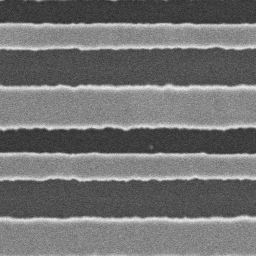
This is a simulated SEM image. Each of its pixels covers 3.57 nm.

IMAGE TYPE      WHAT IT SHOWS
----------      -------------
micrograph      lines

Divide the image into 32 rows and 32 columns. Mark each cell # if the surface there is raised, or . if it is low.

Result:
................................
................................
................................
################################
################################
################################
................................
................................
................................
................................
................................
################################
################################
################################
################################
################################
................................
................................
................................
################################
################################
################################
##..##....######.#..............
................................
................................
................................
................................
##..############################
################################
################################
################################
################################